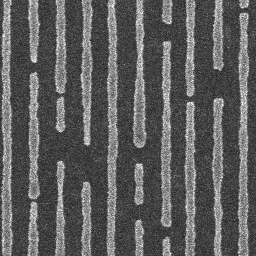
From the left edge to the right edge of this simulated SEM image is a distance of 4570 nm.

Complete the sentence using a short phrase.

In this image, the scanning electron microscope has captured parallel lines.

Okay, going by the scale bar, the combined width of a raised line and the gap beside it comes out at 470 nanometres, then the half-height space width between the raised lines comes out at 341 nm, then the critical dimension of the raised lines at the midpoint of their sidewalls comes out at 132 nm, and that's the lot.